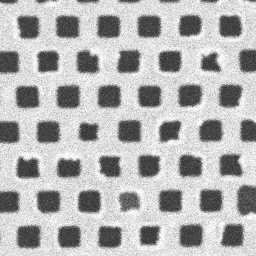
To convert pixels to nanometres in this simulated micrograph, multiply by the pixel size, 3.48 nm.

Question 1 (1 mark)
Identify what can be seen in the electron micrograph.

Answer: a regular array of holes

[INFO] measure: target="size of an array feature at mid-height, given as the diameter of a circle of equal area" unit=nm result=83.7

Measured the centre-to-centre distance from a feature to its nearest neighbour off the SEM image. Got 139 nm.